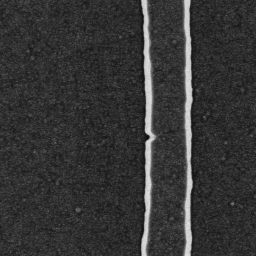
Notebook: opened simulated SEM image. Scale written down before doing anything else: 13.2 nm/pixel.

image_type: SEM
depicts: one or a few lines or trenches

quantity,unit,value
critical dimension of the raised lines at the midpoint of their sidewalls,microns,0.563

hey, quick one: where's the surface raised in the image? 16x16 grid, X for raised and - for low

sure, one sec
---------XXX----
---------XXX----
---------XXX----
---------XXX----
---------XXX----
---------XXX----
---------XXX----
---------XXX----
---------XXX----
---------XXX----
---------XXX----
---------XXX----
---------XXX----
---------XXX----
---------XXX----
---------XXX----